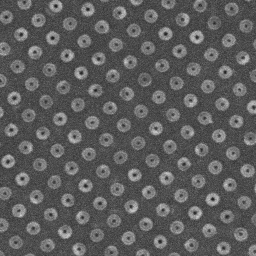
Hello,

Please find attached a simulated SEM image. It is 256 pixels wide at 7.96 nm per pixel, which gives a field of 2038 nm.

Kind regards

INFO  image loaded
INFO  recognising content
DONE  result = a regular array of ring-shaped raised bodies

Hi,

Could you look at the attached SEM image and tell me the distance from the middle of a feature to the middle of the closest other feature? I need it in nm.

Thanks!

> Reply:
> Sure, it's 177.